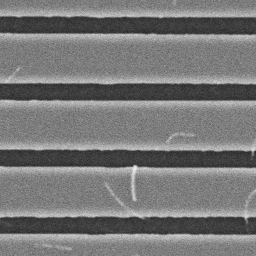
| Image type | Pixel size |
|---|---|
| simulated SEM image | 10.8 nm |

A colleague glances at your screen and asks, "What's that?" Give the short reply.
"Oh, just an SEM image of lines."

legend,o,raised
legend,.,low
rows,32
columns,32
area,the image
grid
oooooooooooooooooooooooooooooooo
oooooooooooooooooooooooooooooooo
................................
................................
oooooooooooooooooooooooooooooooo
oooooooooooooooooooooooooooooooo
oooooooooooooooooooooooooooooooo
oooooooooooooooooooooooooooooooo
oooooooooooooooooooooooooooooooo
oooooooooooooooooooooooooooooooo
................................
................................
................................
oooooooooooooooooooooooooooooooo
oooooooooooooooooooooooooooooooo
oooooooooooooooooooooooooooooooo
oooooooooooooooooooooooooooooooo
oooooooooooooooooooooooooooooooo
oooooooooooooooooooooooooooooooo
................................
................................
oooooooooooooooooooooooooooooooo
oooooooooooooooooooooooooooooooo
oooooooooooooooooooooooooooooooo
oooooooooooooooooooooooooooooooo
oooooooooooooooooooooooooooooooo
oooooooooooooooooooooooooooooooo
................................
................................
oooooooooooooooooooooooooooooooo
oooooooooooooooooooooooooooooooo
oooooooooooooooooooooooooooooooo